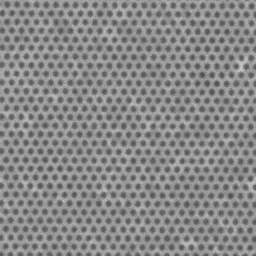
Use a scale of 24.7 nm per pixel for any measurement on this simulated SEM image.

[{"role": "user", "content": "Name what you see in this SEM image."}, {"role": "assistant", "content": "a regular array of holes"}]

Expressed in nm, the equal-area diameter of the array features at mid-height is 178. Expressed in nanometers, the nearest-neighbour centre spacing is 235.